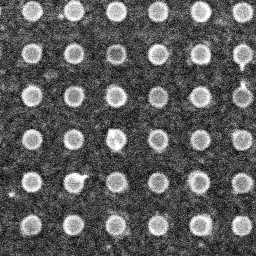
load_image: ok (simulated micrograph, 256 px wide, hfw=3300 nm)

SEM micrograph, a regular array of raised bodies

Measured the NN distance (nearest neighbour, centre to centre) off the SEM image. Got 40.4 pixels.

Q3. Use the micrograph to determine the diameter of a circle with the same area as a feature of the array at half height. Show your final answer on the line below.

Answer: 239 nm